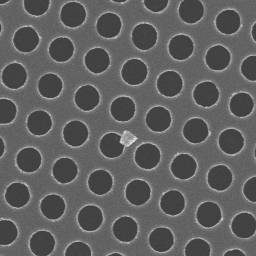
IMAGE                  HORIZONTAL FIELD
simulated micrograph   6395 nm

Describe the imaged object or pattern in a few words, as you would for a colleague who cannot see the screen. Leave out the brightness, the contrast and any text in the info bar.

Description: a regular array of holes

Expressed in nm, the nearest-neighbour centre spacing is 926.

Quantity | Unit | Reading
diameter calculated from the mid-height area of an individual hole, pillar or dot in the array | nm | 633